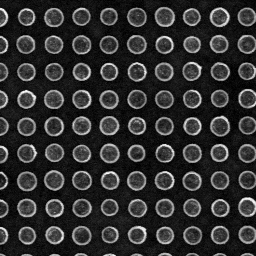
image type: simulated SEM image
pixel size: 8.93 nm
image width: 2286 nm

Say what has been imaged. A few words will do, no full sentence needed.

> a regular array of raised bodies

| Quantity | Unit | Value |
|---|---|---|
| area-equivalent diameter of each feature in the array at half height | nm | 156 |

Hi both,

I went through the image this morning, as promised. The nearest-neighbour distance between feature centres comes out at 0.24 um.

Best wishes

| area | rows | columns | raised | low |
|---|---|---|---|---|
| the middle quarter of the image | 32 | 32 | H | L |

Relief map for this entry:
LLLHHHLLLLHHHLLLLHHHLLLHHHLLLLHH
LLHHHHHLLHHHHLLLHHHHLLLHHHHLLLHH
LLLHHHHLLHHHHLLLHHHHLLLHHHHLLLHH
LLLHHHLLLLHHHLLLLHHHLLLLHHHLLLLH
LLLLLLLLLLLLLLLLLLLLLLLLLLLLLLLL
LLLLLLLLLLLLLLLLLLLLLLLLLLLLLLLL
LLLLLLLLLLLLLLLLLLLLLLLLLLLLLLLL
LLLHHHLLLLHHHLLLHHHHLLLHHHHLLLHH
LLHHHHHLLHHHHLLLHHHHLLLHHHHLLLHH
LLHHHHHLLHHHHLLLHHHHLLLHHHHLLLHH
LLLHHHLLLLHHHLLLLHHHLLLLHHHLLLLH
LLLLLLLLLLLLLLLLLLLLLLLLLLLLLLLL
LLLLLLLLLLLLLLLLLLLLLLLLLLLLLLLL
LLLLHLLLLLHHLLLLLLLLLLLLLLLLLLLL
LLHHHHLLLHHHHLLLHHHHLLLHHHHLLLHH
LLHHHHHLLHHHHHLLHHHHLLLHHHHLLLHH
LLLHHHLLLHHHHLLLHHHHLLLHHHHLLLHH
LLLHHLLLLLLLLLLLLLLLLLLLLLLLLLLL
LLLLLLLLLLLLLLLLLLLLLLLLLLLLLLLL
LLLLLLLLLLLLLLLLLLLLLLLLLLLLLLLL
LLLLHLLLLLHHLLLLLLLLLLLLHHLLLLLH
LLHHHHLLLHHHHLLLHHHHLLLHHHHLLLHH
LLHHHHHLLHHHHHLLHHHHLLLHHHHLLLHH
LLLHHHLLLLHHHLLLLHHHLLLHHHHLLLHH
LLLLLLLLLLLHLLLLLLLLLLLLLLLLLLLL
LLLLLLLLLLLLLLLLLLLLLLLLLLLLLLLL
LLLLLLLLLLLLLLLLLLLLLLLLLLLLLLLL
LLLHHHLLLLHHHLLLLHHHLLLLHHHLLLLH
LLHHHHHLLHHHHLLLHHHHLLLHHHHLLLHH
LLHHHHHLLHHHHHLLHHHHLLLHHHHLLLHH
LLLHHHLLLLHHHLLLHHHHLLLHHHHLLLHH
LLLLLLLLLLLLLLLLLLLLLLLLLLLLLLLH